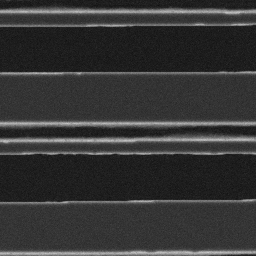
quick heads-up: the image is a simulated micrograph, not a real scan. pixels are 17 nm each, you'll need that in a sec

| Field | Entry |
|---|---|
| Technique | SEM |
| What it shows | lines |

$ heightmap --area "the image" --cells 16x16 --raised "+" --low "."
++++++++++++++++
++++++++++++++++
................
................
................
++++++++++++++++
++++++++++++++++
++++++++++++++++
++++++++++++++++
++++++++++++++++
................
................
...............+
++++++++++++++++
++++++++++++++++
++++++++++++++++